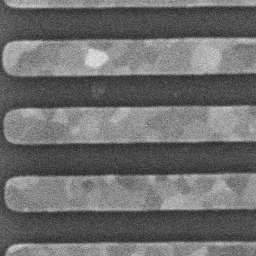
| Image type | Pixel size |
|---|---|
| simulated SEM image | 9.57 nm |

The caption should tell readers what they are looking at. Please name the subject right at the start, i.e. wiring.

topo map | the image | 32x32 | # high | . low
.###############################
................................
................................
................................
................................
.###############################
################################
################################
.###############################
................................
................................
................................
................................
..................##############
.###############################
.###############################
.###############################
.###############################
................................
................................
................................
................................
.###############################
.###############################
.###############################
.###############################
................................
................................
................................
................................
.........#######################
.###############################